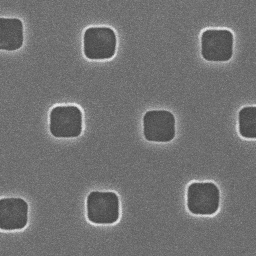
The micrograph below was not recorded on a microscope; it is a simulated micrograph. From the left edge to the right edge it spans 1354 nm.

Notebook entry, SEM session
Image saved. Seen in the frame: holes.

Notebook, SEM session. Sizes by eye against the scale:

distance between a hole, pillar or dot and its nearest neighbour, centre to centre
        454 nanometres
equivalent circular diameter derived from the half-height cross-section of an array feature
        0.184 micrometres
